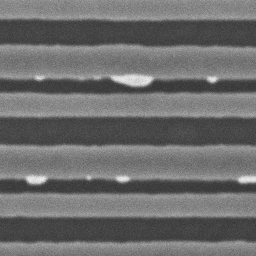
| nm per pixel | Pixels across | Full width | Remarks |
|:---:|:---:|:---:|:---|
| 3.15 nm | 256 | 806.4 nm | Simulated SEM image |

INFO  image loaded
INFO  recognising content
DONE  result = lines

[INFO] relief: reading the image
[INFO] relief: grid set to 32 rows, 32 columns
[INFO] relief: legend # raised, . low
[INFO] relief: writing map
################################
################################
................................
................................
................................
................................
################################
################################
################################
################################
................##..............
................................
################################
################################
....#...................#..#..##
................................
................................
................................
################################
################################
################################
################################
...###.........#.............###
................................
################################
################################
################################
................................
................................
................................
################################
################################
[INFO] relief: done